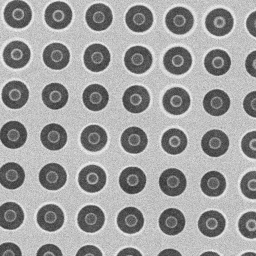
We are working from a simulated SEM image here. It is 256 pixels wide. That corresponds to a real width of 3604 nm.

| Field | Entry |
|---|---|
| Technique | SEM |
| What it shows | an array of small figures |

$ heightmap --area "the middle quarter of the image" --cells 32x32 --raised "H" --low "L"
LHHHHLLLLLLHHHHLLLLLLLHHHLLLLLLL
HHHHHHLLLLHHHHHHLLLLLLHHHLLLLLLL
HHHHHHHHHHHHHHHHHLLLHHHHHHLLLLLH
HHHHHHHHHHHHHHHHHHHHHHHHHHHHHHHH
HHHHHHHHHHHHHHHHHHHHHHHHHHHHHHHH
HHHHHHLLLLHHHHHHHLLLHHHHHHHLLHHH
LHHHHLLLLLLHHHHHLLLLLHHHHLLLLLLH
LHHHHLLHHLLHHHHLLLLLLLHHHLLLLLLH
LHHHHLLHHLLHHHHLLHHLLLHHLLLHHLLL
LHHHHLLHHLLHHHLLLHHLLLHHLLLHHLLL
HHHHHLLLLLLHHHHLLLLLLHHHLLLHHLLL
HHHHHHLLLHHHHHHHLLLLHHHHHLLLLLLH
HHHHHHHHHHHHHHHHHHLHHHHHHHLLLLHH
HHHHHHHHHHHHHHHHHHHHHHHHHHHHHHHH
HHHHHHHHHHHHHHHHHHHHHHHHHHHHHHHH
HHHHHHLLLHHHHHHHHHHHHHHHHHHHHHHH
HHHHLLLLLLHHHHHLLLLLHHHHHHLLLLHH
LHHHLLLHLLLHHHLLLLLLLHHHHLLLLLHH
LHHHLLHHHLLHHHLLHHHLLHHHLLLHHLLH
LHHHLLLHHLLHHHLLHHHLLHHHLLHHHLLH
HHHHLLLLLLLHHHLLLLLLLHHHLLLHLLLH
HHHHHLLLLLHHHHHLLLLLHHHHHLLLLLHH
HHHHHHHHHHHHHHHHHLLHHHHHHHLLLHHH
HHHHHHHHHHHHHHHHHHHHHHHHHHHHHHHH
HHHHHHHHHHHHHHHHHHHHHHHHHHHHHHHH
HHHHHLLLLHHHHHHHLLHHHHHHHHHHHHHH
HHHHLLLLLLHHHHHLLLLLHHHHHLLLLHHH
LHHHLLHHLLLHHHLLLLLLHHHHLLLLLLHH
LHHLLLHHLLLHHLLLHHLLLHHHLLHHLLHH
HHHLLLHHLLLHHHLLHHLLLHHHLLHHHLLH
HHHHLLLLLLHHHHLLLLLLHHHHLLHHLLLH
HHHHHLLLLHHHHHHLLLLLHHHHLLLLLLHH